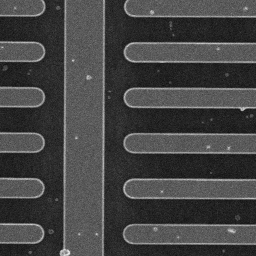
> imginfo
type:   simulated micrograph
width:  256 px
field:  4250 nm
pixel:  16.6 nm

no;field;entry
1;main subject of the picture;groups of lines, slits or small figures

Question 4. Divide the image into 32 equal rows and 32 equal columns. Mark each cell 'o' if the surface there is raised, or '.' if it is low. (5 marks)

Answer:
oooooo..ooooo...oooooooooooooooo
ooooo...ooooo...oooooooooooooooo
........ooooo...................
........ooooo...................
........ooooo...................
ooooo...ooooo...oooooooooooooooo
oooooo..ooooo...oooooooooooooooo
ooooo...ooooo...oooooooooooooooo
........ooooo...................
........ooooo...................
........ooooo...................
ooooo...ooooo...oooooooooooooooo
ooooo...ooooo...oooooooooooooooo
........ooooo.................o.
........ooooo...................
........ooooo...................
........ooooo...................
ooooo...ooooo...oooooooooooooooo
ooooo...ooooo...oooooooooooooooo
........ooooo...................
........ooooo...................
........ooooo...................
ooooo...ooooo...oooooooooooooooo
ooooo...ooooo..ooooooooooooooooo
ooooo...ooooo...oooooooooooooooo
........ooooo...................
........ooooo...................
........ooooo...................
ooooo...ooooo...oooooooooooooooo
ooooo...ooooo..ooooooooooooooooo
........ooooo...................
........ooooo...................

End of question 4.